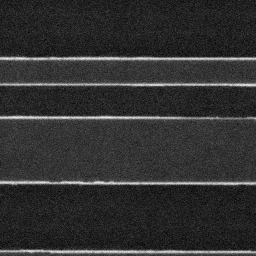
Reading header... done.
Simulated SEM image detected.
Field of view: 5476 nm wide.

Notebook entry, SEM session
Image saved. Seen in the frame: lines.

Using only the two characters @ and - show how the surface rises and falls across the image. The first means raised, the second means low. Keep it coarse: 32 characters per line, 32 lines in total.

--------------------------------
--------------------------------
--------------------------------
--------------------------------
--------------------------------
--------------------------------
--------------------------------
@@@@@@@@@@@@@@@@@@@@@@@@@@@@@@@@
@@@@@@@@@@@@@@@@@@@@@@@@@@@@@@@@
@@@@@@@@@@@@@@@@@@@@@@@@@@@@@@@@
@@@@@@@@@@@@@@@@@@@@@@@@@@@@@@@@
@@@@@@@@@@@@@@@@@@@@@@@@@@@@@@@@
@@@@@@@@@@@@@@@@@@@@@@@@@@@@@@@@
@@@@@@@@@@@@@@@@@@@@@@@@@@@@@@@@
@@@@@@@@@@@@@@@@@@@@@@@@@@@@@@@@
@@@@@@@@@@@@@@@@@@@@@@@@@@@@@@@@
@@@@@@@@@@@@@@@@@@@@@@@@@@@@@@@@
@@@@@@@@@@@@@@@@@@@@@@@@@@@@@@@@
@@@@@@@@@@@@@@@@@@@@@@@@@@@@@@@@
@@@@@@@@@@@@@@@@@@@@@@@@@@@@@@@@
@@@@@@@@@@@@@@@@@@@@@@@@@@@@@@@@
@@@@@@@@@@@@@@@@@@@@@@@@@@@@@@@@
@@@@@@@@@@@@@@@@@@@@@@@@@@@@@@@@
--------------------------------
--------------------------------
--------------------------------
--------------------------------
--------------------------------
--------------------------------
--------------------------------
--------------------------------
@@@@@@@@@@@@@---@---------------